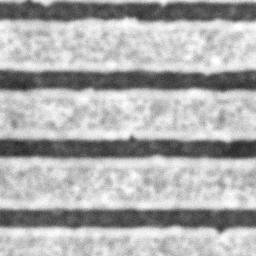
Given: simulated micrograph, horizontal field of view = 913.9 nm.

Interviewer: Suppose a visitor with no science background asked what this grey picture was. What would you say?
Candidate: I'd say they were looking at one or a few lines or trenches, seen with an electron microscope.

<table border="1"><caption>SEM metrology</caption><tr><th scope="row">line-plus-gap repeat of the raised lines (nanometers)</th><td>246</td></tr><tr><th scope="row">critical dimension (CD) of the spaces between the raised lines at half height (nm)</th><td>95.5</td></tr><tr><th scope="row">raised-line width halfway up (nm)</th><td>149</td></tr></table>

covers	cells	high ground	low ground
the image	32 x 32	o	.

................................
................................
................................
oooooooooooooooooooooooooooooooo
oooooooooooooooooooooooooooooooo
oooooooooooooooooooooooooooooooo
oooooooooooooooooooooooooooooooo
oooooooooooooooooooooooooooooooo
.........................oo.....
................................
................................
................................
oooooooooooooooooooooooooooooooo
oooooooooooooooooooooooooooooooo
oooooooooooooooooooooooooooooooo
oooooooooooooooooooooooooooooooo
oooooooooooooooooooooooooooooooo
................................
................................
................................
oooooooooooooooooooooooooooooooo
oooooooooooooooooooooooooooooooo
oooooooooooooooooooooooooooooooo
oooooooooooooooooooooooooooooooo
oooooooooooooooooooooooooooooooo
oooooooooooooooooooooooooooooooo
................................
................................
................................
oooooooooooooooooooooooooooooooo
oooooooooooooooooooooooooooooooo
oooooooooooooooooooooooooooooooo